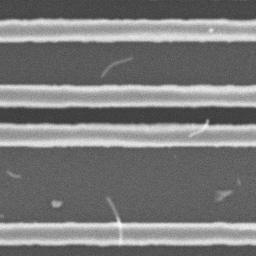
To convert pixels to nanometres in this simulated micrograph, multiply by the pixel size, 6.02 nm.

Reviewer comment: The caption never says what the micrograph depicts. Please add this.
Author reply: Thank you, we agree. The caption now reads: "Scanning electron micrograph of lines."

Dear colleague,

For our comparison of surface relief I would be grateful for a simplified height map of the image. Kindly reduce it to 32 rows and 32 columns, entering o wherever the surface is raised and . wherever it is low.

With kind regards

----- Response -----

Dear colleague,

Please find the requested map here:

................................
................................
.oo.ooooooooooooooo.ooooooooo...
oooooooooooooooooooooooooooooooo
oooooooooooooooooooooooooooooooo
................................
................................
................................
................................
................................
................................
oooooooooooooooooooooooooooooooo
oooooooooooooooooooooooooooooooo
................................
................................
oo...o....ooo........o...o......
oooooooooooooooooooooooooooooooo
oooooooooooooooooooooooooooooooo
................................
................................
................................
................................
................................
................................
................................
................................
................................
................................
oooooooooooooooooooooooooooooooo
oooooooooooooooooooooooooooooooo
ooo..oooo..oooooooo..ooooo..oooo
................................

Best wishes